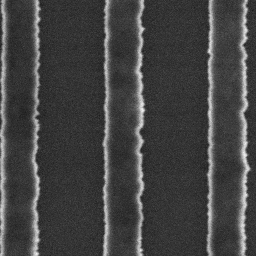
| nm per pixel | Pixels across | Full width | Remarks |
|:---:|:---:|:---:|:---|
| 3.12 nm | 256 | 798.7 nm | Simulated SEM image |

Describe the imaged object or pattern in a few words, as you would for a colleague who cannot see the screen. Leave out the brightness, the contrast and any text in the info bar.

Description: lines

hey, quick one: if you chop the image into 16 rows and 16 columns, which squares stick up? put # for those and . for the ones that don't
##.....##....##.
##.....##....##.
##.....##....##.
##.....##....##.
##.....##....##.
##.....##....##.
##.....##....##.
##.....##....##.
##.....##....##.
##.....##....##.
##.....##....##.
##.....##....##.
##.....##....##.
##.....##....##.
##.....##....##.
##....###....##.